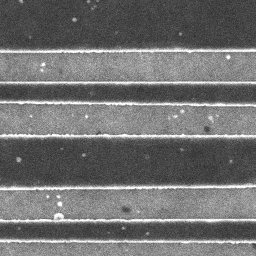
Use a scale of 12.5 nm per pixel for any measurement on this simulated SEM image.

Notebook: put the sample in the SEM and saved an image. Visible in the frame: lines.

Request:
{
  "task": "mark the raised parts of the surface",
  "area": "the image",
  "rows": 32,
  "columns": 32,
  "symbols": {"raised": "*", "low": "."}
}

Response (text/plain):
********************************
********************************
********************************
********************************
********************************
********************************
................................
................................
................................
................................
********************************
********************************
********************************
................................
................................
................................
................................
********************************
********************************
********************************
********************************
********************************
********************************
*******************.*...........
................................
................................
................................
********************************
********************************
********************************
................................
................................